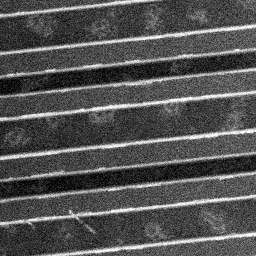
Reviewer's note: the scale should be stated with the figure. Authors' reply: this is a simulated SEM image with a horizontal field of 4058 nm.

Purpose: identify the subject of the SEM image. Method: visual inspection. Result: parallel lines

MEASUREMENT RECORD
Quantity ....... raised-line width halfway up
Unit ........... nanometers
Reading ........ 360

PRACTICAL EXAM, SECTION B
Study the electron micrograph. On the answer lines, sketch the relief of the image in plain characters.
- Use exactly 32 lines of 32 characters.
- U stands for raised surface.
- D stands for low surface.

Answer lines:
UUUUUUUUUUUUUUDDDDDDDDDDDDDDDDDD
UUUUUDDDDDDDDDDDDDDDDDDDDDDDDDDD
DDDDDDDDDDDDDDDDDDDDDDDDDDDDDDDD
DDDDDDDDDDDDDDDDDDDDDDDDDDDDDUUU
DDDDDDDDDDDDDDDDDDDDUUUUUUUUUUUU
DDDDDDDDDDDUUUUUUUUUUUUUUUUUUUUU
DDUUUUUUUUUUUUUUUUUUUUUUUUUUUDDD
UUUUUUUUUUUUUUUUUUUUDDDDDDDDDDDD
UUUUUUUUUUDDDDDDDDDDDDDDDDDDDDDD
UDDDDDDDDDDDDDDDDDDDDDDDUUUUUUUU
DDDDDDDDDDDDDDDUUUUUUUUUUUUUUUUU
DDDDDDUUUUUUUUUUUUUUUUUUUUUUUUUU
UUUUUUUUUUUUUUUUUUUUUUUDDDDDDDDD
UUUUUUUUUUUUUUDDDDDDDDDDDDDDDDDD
UUUUDDDDDDDDDDDDDDDDDDDDDDDDDDDD
DDDDDDDDDDDDDDDDDDDDDDDDDDDDDDDD
DDDDDDDDDDDDDDDDDDDDDDDDDDDDDDUU
DDDDDDDDDDDDDDDDDDDDDUUUUUUUUUUU
DDDDDDDDDDDDUUUUUUUUUUUUUUUUUUUU
DDUUUUUUUUUUUUUUUUUUUUUUUUUUDDDD
UUUUUUUUUUUUUUUUUUUDDDDDDDDDDDDD
UUUUUUUUUUDDDDDDDDDDDDDDDDDDDDDD
UDDDDDDDDDDDDDDDDDDDDDDDUUUUUUUU
DDDDDDDDDDDDDDDUUUUUUUUUUUUUUUUU
DDDDDDUUUUUUUUUUUUUUUUUUUUUUUUUD
UUUUUUUUUUUUUUUUUUUUUUDDDDDDDDDD
UUUUUUUUUUUUUDDDDDDDDDDDDDDDDDDD
UUUUDDDDDDDDDDDDDDDDDDDDDDDDDDDD
DDDDDDDDDDDDDDDDDDDDDDDDDDDDDDDD
DDDDDDDDDDDDDDDDDDDDDDDDDDDDDUUU
DDDDDDDDDDDDDDDDDDDDUUUUUUUUUUUU
DDDDDDDDDDDUUUUUUUUUUUUUUUUUUUUU